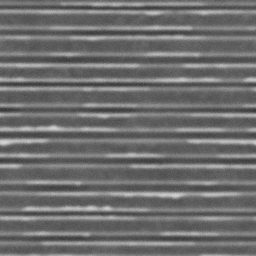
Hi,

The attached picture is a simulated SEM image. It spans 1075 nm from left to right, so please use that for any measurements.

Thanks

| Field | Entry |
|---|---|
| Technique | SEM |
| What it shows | parallel lines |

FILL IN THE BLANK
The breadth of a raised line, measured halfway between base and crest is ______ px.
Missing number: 18.2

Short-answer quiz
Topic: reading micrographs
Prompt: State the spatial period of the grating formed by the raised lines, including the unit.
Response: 108 nanometers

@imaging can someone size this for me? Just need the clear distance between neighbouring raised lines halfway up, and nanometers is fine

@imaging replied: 29.4